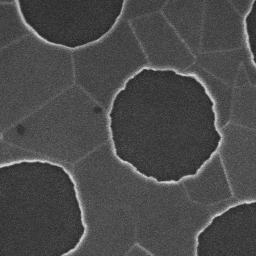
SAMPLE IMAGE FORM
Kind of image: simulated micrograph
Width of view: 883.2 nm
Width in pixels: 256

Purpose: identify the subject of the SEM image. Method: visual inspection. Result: holes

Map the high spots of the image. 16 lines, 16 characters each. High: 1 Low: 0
1000000011111111
1100000111111110
1110001111111110
1111111111111111
1111111110011111
1111111100000111
1111111000000111
1111111000000111
1111111000000011
1111111000000111
0000111100001111
0000011111111111
0000011111111111
0000011111111100
0000011111111000
0000011111110000